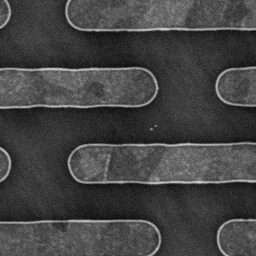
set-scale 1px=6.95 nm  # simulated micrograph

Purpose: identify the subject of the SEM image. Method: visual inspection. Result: groups of lines, slits or small figures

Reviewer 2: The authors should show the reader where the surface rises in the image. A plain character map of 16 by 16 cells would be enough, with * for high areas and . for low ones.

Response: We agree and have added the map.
*...************
.....***********
................
................
*********.....**
**********....**
*********......*
................
................
.....***********
*...************
................
................
................
**********....**
**********....**